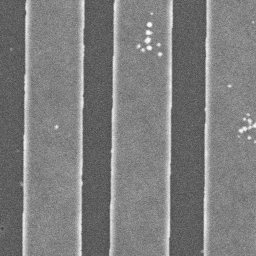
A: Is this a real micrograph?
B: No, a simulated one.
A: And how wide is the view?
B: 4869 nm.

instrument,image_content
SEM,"lines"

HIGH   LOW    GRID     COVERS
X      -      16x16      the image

--XXX--XXXX--XXX
--XXX--XXXX--XXX
--XXX--XXXX--XXX
--XXX--XXXX--XXX
--XXX--XXXX--XXX
--XXX--XXXX--XXX
--XXX--XXXX--XXX
--XXX--XXXX--XXX
--XXX--XXXX--XXX
--XXX--XXXX--XXX
--XXX--XXXX--XXX
--XXX--XXXX--XXX
--XXX--XXXX--XXX
-XXXX--XXXX--XXX
-XXXX--XXXX--XXX
-XXXX--XXXX--XXX